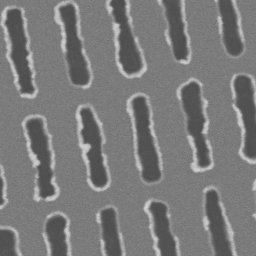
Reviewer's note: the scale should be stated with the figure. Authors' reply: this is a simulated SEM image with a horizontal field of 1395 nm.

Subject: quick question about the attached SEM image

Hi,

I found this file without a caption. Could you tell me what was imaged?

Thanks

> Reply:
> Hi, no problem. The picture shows holes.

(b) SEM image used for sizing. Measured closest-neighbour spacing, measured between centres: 292 nanometres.